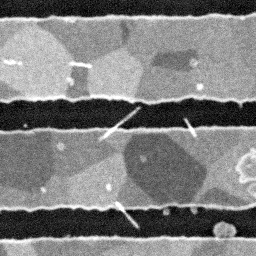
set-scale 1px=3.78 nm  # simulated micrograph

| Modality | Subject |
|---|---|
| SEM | lines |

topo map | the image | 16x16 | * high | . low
................
****************
****************
****************
****************
****************
................
................
****************
****************
****************
****************
****************
................
................
****************